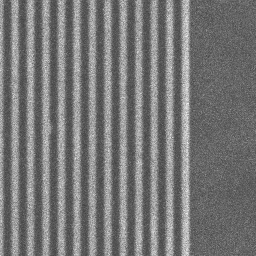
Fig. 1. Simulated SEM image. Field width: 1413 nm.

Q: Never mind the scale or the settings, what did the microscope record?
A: parallel lines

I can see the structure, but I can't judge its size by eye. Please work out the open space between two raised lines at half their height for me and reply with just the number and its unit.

10 pixels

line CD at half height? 30.4 nm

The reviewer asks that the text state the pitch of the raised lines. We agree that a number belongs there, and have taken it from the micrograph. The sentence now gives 85.3 nm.